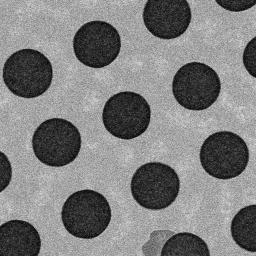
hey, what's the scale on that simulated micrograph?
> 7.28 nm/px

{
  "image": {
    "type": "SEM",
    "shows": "a regular array of holes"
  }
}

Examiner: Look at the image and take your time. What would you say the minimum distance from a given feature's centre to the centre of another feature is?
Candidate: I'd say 543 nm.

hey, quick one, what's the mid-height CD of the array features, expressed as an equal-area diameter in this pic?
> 49.1 pixels